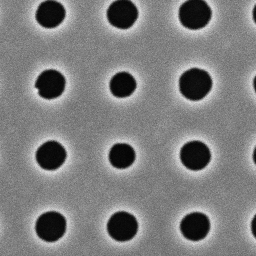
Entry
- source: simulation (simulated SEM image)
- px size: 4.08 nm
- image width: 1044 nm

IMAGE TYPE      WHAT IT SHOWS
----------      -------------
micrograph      a regular array of holes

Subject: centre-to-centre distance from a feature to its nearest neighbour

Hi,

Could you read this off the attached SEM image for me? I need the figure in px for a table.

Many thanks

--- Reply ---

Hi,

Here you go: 71.1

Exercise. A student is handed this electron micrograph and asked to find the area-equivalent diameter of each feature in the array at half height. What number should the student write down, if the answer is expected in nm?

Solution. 123